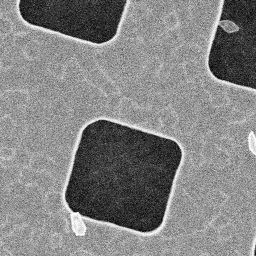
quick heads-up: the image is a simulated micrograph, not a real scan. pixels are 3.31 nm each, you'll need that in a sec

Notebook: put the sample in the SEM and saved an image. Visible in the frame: holes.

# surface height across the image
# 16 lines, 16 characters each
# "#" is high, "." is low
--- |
#.......######..
##.....#######..
#####..######...
#############...
#############...
################
################
################
#####.....######
#####......#####
####.......#####
####.......#####
####.......#####
#####.....######
################
################